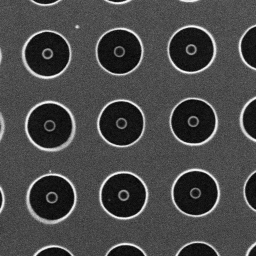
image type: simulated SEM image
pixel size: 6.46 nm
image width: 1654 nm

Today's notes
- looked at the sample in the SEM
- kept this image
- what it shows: an array of small figures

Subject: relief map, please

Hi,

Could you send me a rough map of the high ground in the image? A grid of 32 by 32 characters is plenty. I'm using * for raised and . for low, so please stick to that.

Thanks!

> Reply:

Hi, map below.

*****.**************************
********************************
********************************
***********************..******.
****....*****....*****....****..
***.....****......***......***..
***......***..*...***......***..
***......***......***......***..
****....*****....*****....******
*****..*************************
********************************
********************************
***********************..*******
****....*****....*****....*****.
****.....****.....***......***..
***...*..***...*..***...*..***..
***......****.....****.....****.
****.....****....******...******
*****..*************************
********************************
********************************
***********************...******
*****...*****.....****.....****.
****.....****.....****.....****.
****..*..****..*..****..*..****.
****.....****.....****.....****.
****.....*****...******...******
*****...************************
********************************
********************************
************************..******
*****....*****....****.....****.